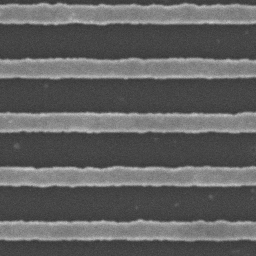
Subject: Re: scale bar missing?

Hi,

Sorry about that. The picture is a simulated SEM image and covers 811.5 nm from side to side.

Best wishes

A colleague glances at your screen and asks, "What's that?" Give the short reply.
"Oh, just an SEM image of lines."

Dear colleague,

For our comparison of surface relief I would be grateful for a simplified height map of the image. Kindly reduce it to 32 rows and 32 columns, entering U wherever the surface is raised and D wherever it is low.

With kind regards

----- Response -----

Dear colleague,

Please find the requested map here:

DDDDDUDUDDDDDDDDDDDDDDDUDDDDDDDD
UUUUUUUUUUUUUUUUUUUUUUUUUUUUUUUU
UUUUUUUUUUUUUUUUUUUUUUUUUUUUUUUU
DDDDDDDDDDDDDDDDDDDDDDDDDDDDDDDD
DDDDDDDDDDDDDDDDDDDDDDDDDDDDDDDD
DDDDDDDDDDDDDDDDDDDDDDDDDDDDDDDD
DDDDDDDDDDDDDDDDDDDDDDDDDDDDDDDD
UDUUUUUUUUUUDDDUUUUUUUUUUUUDUDUD
UUUUUUUUUUUUUUUUUUUUUUUUUUUUUUUU
UUUUUUUUUUUUUUUUUUUUUUUUUUUUUUUU
DDDDDDDDDDDDDDDDDDDDDDDDDDDDDDDD
DDDDDDDDDDDDDDDDDDDDDDDDDDDDDDDD
DDDDDDDDDDDDDDDDDDDDDDDDDDDDDDDD
DDDDDDDDDDDDDDDDDDDDDDDDDDDDDDDD
UUUUUUUUUUUUUUUUUUUUUUUUUUUUUUUU
UUUUUUUUUUUUUUUUUUUUUUUUUUUUUUUU
DDDDDDDDDDDDDDDDDDDDDDDDUDDDUUDD
DDDDDDDDDDDDDDDDDDDDDDDDDDDDDDDD
DDDDDDDDDDDDDDDDDDDDDDDDDDDDDDDD
DDDDDDDDDDDDDDDDDDDDDDDDDDDDDDDD
DDDDDDDDDDDDDDDDDDDDDDDDDDDDDDDD
UUUUUUUUUUUUUUUUUUUUUUUUUUUUUUUU
UUUUUUUUUUUUUUUUUUUUUUUUUUUUUUUU
DDDDDDDDDDDDDDDDDDDDDDDDDDDDDDDD
DDDDDDDDDDDDDDDDDDDDDDDDDDDDDDDD
DDDDDDDDDDDDDDDDDDDDDDDDDDDDDDDD
DDDDDDDDDDDDDDDDDDDDDDDDDDDDDDDD
DDDDDDDDDDDDDDDDDDDDDDDDDDDDDDDD
UUUUUUUUUUUUUUUUUUUUUUUUUUUUUUUU
UUUUUUUUUUUUUUUUUUUUUUUUUUUUUUUU
DDDDDDDDDDDDDDDDDDDDDDDDDDDDDDDD
DDDDDDDDDDDDDDDDDDDDDDDDDDDDDDDD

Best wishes